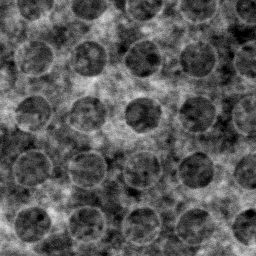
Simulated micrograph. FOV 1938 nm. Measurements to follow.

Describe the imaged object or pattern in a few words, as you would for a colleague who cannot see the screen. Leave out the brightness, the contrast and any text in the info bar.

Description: a regular array of raised bodies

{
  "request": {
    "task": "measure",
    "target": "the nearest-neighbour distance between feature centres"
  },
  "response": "411 nanometres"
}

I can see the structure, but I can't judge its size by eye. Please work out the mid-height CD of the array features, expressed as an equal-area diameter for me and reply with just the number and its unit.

288 nm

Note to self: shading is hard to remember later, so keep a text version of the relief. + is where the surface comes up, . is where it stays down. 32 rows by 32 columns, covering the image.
..+++++..++++...++++...++++..+++
..++++...++++...++++...++++...++
...++.....++.....++....+++....++
................................
................................
...+++....+++....++.....++.....+
..+++++..++++...++++...++++...++
..+++++..++++...++++..+++++..+++
..++++...++++...++++...++++..+++
....+.....++.....++.....++....++
................................
................................
...+++....+++....++....+++....++
..++++...++++...++++..+++++..+++
..++++...+++++..++++..+++++..+++
..++++...++++...++++...++++..+++
..........++.....++.....++....++
................................
................................
...+++....+++....++....+++....++
..++++...++++...++++..+++++..+++
..++++...++++..+++++..+++++..+++
..++++...++++...++++..+++++..+++
.................+......+.....++
................................
................................
..++++...++++...+++....+++....++
..++++...++++...++++..+++++..+++
..++++...++++...++++..+++++..+++
..++++...++++...++++..+++++..+++
.................+.....++.....++
................................